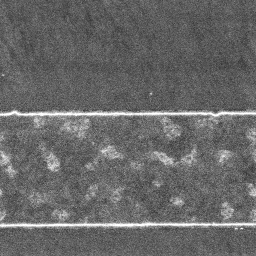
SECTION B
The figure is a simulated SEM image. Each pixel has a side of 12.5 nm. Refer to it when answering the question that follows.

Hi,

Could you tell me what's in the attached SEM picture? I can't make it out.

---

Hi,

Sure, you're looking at one or a few lines or trenches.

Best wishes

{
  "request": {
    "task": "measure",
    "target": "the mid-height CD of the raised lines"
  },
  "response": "1390 nm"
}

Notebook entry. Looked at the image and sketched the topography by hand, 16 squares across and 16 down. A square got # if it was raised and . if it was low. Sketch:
................
................
................
................
................
................
................
################
################
################
################
################
################
################
................
................